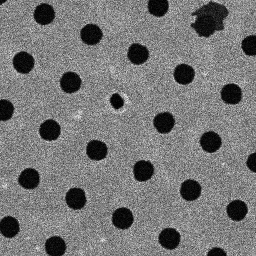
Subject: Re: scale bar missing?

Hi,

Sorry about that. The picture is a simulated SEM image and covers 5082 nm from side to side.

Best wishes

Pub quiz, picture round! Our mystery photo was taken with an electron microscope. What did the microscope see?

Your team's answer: a regular array of holes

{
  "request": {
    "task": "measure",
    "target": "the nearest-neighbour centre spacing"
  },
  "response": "1010 nm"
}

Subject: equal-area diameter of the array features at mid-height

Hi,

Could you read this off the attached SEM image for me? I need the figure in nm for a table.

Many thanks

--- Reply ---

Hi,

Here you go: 439